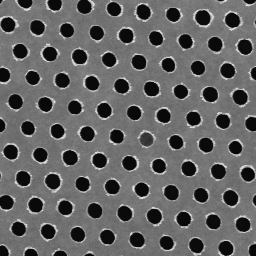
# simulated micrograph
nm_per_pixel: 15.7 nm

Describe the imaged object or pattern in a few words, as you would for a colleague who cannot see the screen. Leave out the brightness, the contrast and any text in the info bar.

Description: a regular array of holes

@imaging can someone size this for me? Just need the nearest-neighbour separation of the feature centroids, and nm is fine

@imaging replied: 458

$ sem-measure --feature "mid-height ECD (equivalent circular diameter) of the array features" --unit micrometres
0.227